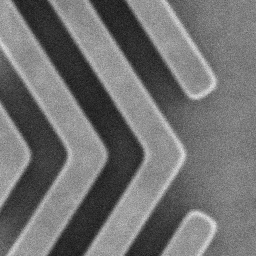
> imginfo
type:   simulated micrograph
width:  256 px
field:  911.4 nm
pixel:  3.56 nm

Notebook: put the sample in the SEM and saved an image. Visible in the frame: groups of lines, slits or small figures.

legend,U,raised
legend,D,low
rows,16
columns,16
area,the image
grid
UDDUUUDDUUUDDDDD
UUDDUUDDDUUDDDDD
UUDDDUUDDDUUDDDD
UUUDDUUUDDUUUDDD
DUUUDDUUDDDUUDDD
DDUUDDDUUDDUUDDD
DDUUUDDUUUDDDDDD
UDDUUDDDUUDDDDDD
UDDDUUDDDUUDDDDD
UUDDUUUDDUUDDDDD
UUDDUUDDDUUDDDDD
UDDUUUDDUUUDDDDD
DDDUUDDDUUDDDDDD
DDUUDDDUUDDDUDDD
DUUUDDUUUDDUUDDD
DUUDDDUUDDUUUDDD